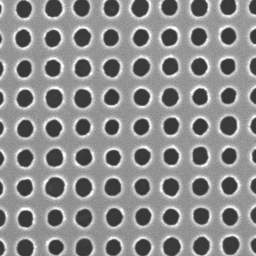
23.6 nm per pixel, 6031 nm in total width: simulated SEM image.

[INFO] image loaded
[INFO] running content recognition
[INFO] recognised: a regular array of holes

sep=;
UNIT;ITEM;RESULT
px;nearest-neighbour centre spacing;28.8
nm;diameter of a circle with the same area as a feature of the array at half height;407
